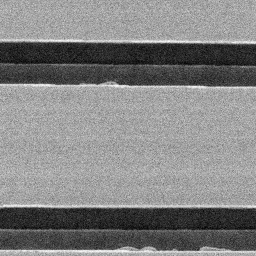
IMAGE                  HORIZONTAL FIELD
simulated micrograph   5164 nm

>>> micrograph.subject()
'lines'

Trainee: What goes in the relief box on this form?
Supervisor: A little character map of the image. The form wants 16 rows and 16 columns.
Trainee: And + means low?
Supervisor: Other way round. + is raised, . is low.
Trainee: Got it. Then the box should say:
++++++++++++++++
++++++++++++++++
++++++++++++++++
................
................
++++++++++++++++
++++++++++++++++
++++++++++++++++
++++++++++++++++
++++++++++++++++
++++++++++++++++
++++++++++++++++
++++++++++++++++
................
................
................